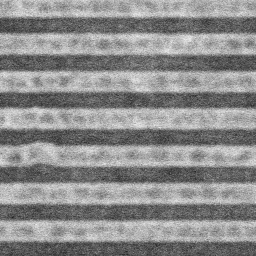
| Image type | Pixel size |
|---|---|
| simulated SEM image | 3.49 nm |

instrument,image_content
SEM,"parallel lines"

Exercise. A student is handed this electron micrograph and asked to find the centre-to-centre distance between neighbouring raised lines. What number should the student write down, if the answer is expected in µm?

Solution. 0.13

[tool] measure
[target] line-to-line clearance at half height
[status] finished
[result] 0.0738 micrometres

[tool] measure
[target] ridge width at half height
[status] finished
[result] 57.2 nm